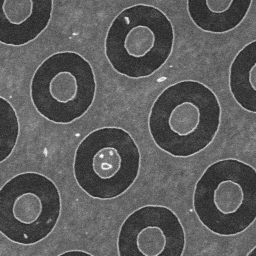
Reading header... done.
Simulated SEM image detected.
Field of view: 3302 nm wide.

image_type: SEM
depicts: ring-shaped grooves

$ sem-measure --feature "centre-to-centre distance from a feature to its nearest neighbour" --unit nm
1130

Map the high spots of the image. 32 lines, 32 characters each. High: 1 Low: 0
11110001111111111111111000111001
11110011111111100000111100010001
01100011111111000000011100000011
00000011111111000100011110000111
00000111111110001110001111111111
10011111111110001110001111111110
11111111011110001100011111111100
11111100000111000000011111111000
11111000000111000000111111111000
11110001100011110011111111111001
11110011110011111111110001111001
11110011100011111111000000011000
01110001100011111111000000011100
00111000000111111110001110011110
00111000001111111110011110011111
00111111111111111110011110011111
00111111111100001110001100011111
00111111110000001110000000111111
00111111110001000111000001111111
01111111100011100111110111111111
11111111100011100111111111100001
11111111100011100111111111000000
10000011110000000111111110000000
00000001110000001111111100011100
00010001111001111111111100011100
00111000111111111111111100011100
00111001111111111000001110001000
00110001111111110000001110000000
00000001111111100011000111000001
10000011111111100111000111111111
11101111111111100111100111111111
11111111001111100011000111111110